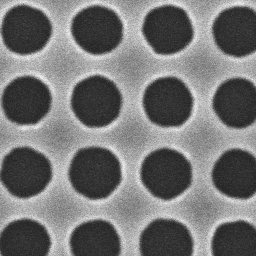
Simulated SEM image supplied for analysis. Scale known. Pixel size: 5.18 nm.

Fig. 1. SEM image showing holes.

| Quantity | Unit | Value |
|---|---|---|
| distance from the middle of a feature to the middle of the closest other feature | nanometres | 365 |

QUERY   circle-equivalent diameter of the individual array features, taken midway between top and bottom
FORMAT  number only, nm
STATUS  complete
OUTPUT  269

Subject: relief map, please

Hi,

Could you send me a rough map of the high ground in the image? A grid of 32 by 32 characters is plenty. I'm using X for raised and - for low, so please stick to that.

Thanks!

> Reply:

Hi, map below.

XXXXXXXXXXXXXXXXXXXXXXXXXXXXXXXX
X----XXXXX----XXXXX----XXXXX----
------XXX------XXX------XXX-----
------XXX-------XX------XX------
------XXX------XXX------XXX-----
------XXXX-----XXXX-----XXX-----
XX---XXXXXX---XXXXX----XXXXX----
XXXXXXXXXXXXXXXXXXXXXXXXXXXXXXXX
XXXXXXXXXXXXXXXXXXXXXXXXXXXXXXXX
XXX-XXXXXXX--XXXXXXXXXXXXXXXXXXX
X-----XXX-----XXXXX----XXXXX----
------XXX------XXX------XXX-----
------XXX------XXX------XXX-----
------XXX------XXX------XXX-----
X-----XXX------XXX------XXX-----
XX---XXXXX----XXXXX----XXXXX----
XXXXXXXXXXXXXXXXXXXXXXXXXXXXXXXX
XXXXXXXXXXXXXXXXXXXXXXXXXXXXXXXX
XX--XXXXXX---XXXXXXX-XXXXXXXX-XX
X-----XXX------XXX-----XXXXX----
------XXX------XXX------XXX-----
-------XX------XX-------XX------
------XXX------XXX------XX------
X-----XXX------XXX------XXX-----
XX---XXXXX----XXXXX---XXXXXX----
XXXXXXXXXXXXXXXXXXXXXXXXXXXXXXXX
XXXXXXXXXXXXXXXXXXXXXXXXXXXXXXXX
XX--XXXXXXX--XXXXXX---XXXXXXX--X
X-----XXX-----XXXX-----XXXX-----
------XXX------XX-------XXX-----
------XXX------XX-------XX------
------XXX------XX-------XX------